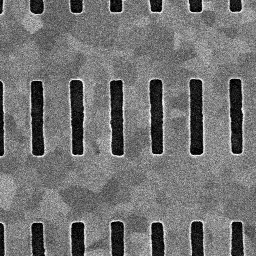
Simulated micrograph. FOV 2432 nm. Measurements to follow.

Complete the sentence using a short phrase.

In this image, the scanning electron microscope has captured holes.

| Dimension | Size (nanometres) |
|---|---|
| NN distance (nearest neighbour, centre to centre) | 378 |